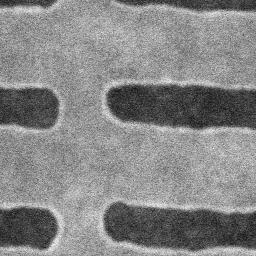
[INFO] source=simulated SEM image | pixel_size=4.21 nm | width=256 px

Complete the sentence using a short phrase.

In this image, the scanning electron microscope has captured holes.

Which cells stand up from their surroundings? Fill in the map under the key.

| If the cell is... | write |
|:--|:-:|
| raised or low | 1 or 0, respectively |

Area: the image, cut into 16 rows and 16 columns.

1001111111100000
1111111111111111
1111111111111111
1111111111111111
1111111111111111
0001111000000011
0000111000000000
0000111000000000
1111111111111111
1111111111111111
1111111111111111
1111111111111111
1111111111111111
0001110000000000
0000111000000000
1001111110000010